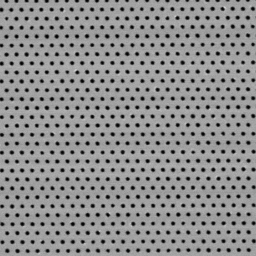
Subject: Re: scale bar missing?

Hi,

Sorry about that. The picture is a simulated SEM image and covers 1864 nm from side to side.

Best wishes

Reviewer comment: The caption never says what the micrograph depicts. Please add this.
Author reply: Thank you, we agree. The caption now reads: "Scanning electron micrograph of a regular array of holes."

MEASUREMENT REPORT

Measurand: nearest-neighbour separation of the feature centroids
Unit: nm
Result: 70.7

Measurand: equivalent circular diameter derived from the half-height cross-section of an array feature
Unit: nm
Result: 28.4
